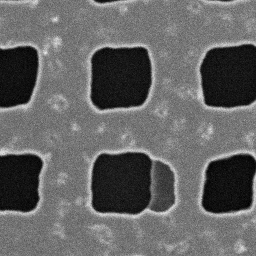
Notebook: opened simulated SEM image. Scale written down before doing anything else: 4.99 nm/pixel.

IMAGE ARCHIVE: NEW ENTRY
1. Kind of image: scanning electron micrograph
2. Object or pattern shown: holes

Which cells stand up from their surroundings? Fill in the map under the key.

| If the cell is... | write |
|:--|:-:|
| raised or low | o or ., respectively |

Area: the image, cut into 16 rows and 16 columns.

oooooooooooooooo
oooooooooooooooo
oooooooooooooooo
..oooo...oooo...
..oooo...oooo...
..oooo...oooo...
.ooooo...oooo...
oooooooooooooooo
oooooooooooooooo
oooooooo.ooooooo
...ooo.....oo...
..oooo.....oo...
..oooo.....oo...
oooooooooooooooo
oooooooooooooooo
oooooooooooooooo